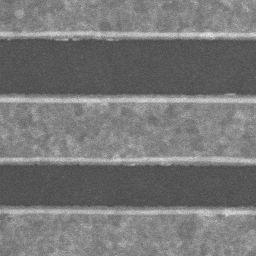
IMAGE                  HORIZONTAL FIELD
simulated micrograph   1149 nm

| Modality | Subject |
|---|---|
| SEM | one or a few lines or trenches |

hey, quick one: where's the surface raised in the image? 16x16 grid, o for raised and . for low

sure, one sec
oooooooooooooooo
oooooooooooooooo
................
................
................
................
oooooooooooooooo
oooooooooooooooo
oooooooooooooooo
oooooooooooooooo
................
................
................
oooooooooooooooo
oooooooooooooooo
oooooooooooooooo